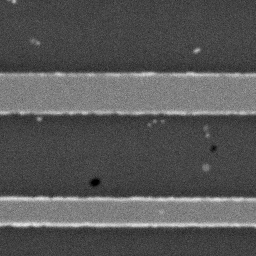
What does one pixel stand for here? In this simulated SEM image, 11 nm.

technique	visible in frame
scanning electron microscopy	lines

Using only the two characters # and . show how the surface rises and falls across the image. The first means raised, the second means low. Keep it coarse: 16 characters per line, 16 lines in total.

................
................
................
................
................
################
################
................
................
................
................
................
################
################
................
................